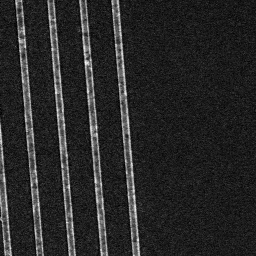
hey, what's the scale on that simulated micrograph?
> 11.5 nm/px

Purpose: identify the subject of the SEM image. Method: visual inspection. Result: parallel lines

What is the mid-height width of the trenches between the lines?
0.305 microns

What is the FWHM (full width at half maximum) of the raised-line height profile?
61.4 nanometers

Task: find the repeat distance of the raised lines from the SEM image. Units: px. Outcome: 32